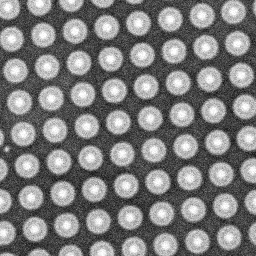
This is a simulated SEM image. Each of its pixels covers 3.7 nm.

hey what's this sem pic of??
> an array of small figures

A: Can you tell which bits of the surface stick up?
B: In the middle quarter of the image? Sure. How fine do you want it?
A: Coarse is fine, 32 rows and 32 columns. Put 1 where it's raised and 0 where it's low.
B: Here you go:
01111110011111000011100000000000
01111100001110000000000000000000
00011000000000000000000000111110
00000000000000000011111000111110
00000000000111100011111000111111
00011110001111100011111000111110
00111111001111110011111000111110
00111111001111110011111000011100
00111111001111100001110000000000
00111110000110000000000000000000
00001000000000000000000000011110
00000000000000000001111100011111
00000000000111110001111100011111
00001111000111110001111100011111
00011111000111111001111100011111
00011111100111110001111100000100
10011111000111110000010000000000
10011111000000000000000000000000
00000100000000000000000000001111
00000000000000000000111110001111
00000000000001111000111110001111
00001111100011111000111110001111
10001111100011111000111110001111
11001111110011111000111110000010
11001111100011111000001000000000
11001111100000000000000000000000
10000000000000000000000000000111
00000000000000000000011111000111
00000001000001111100011111001111
00000111110001111100011111000111
11000111110001111100011111000111
11100111111001111100011111000000